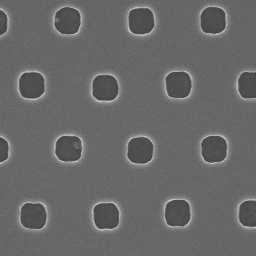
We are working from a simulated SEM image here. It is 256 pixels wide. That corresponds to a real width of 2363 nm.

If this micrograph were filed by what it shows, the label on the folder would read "a regular array of holes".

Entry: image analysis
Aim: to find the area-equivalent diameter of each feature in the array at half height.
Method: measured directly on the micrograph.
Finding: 254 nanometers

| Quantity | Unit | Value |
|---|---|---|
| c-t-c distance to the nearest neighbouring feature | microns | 0.665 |